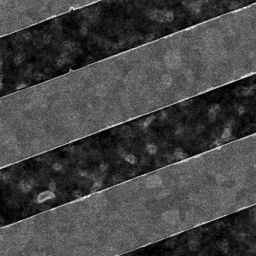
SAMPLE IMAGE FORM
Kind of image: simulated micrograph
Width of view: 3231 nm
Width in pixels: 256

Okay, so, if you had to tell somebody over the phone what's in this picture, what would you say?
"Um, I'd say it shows one or a few lines or trenches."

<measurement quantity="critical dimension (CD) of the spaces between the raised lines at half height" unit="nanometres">707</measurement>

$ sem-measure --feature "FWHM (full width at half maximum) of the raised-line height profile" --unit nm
828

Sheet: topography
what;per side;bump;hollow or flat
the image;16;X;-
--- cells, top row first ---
XXXXX----------X
XX----------XXXX
----------XXXXXX
-------XXXXXXXXX
----XXXXXXXXXXXX
--XXXXXXXXXXX---
XXXXXXXXXXX-----
XXXXXXXX--------
XXXXX-----------
XXX----------XXX
----------XXXXXX
-------XXXXXXXXX
-----XXXXXXXXXXX
--XXXXXXXXXXXX--
XXXXXXXXXXX-----
XXXXXXXXX-------